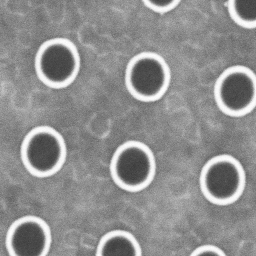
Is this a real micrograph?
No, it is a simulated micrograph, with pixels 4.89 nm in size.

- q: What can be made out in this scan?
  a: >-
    raised bodies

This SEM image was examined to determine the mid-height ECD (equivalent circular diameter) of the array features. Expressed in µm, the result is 0.211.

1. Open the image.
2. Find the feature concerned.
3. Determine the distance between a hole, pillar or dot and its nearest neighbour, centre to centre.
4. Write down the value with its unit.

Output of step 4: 443 nm